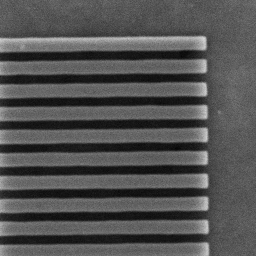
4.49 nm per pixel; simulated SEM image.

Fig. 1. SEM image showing groups of lines, slits or small figures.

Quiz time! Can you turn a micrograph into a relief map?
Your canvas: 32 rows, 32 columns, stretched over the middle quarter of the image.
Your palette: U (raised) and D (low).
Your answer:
UUUUUUUUUUUUUUUUUUUUUUUUUUUUUUUU
UUUUUUUUUUUUUUUUUUUUUUUUUUUUUUUU
DDDDDDDDDDDDDDDDDDDDDDDDDDDDDDDD
DDDDDDDDDDDDDDDDDDDDDDDDDDDDDDDD
DDDDDDDDDDDDDDDDDDDDDDDDDDDDDDDD
UUUUUUUUUUUUUUUUUUUUUUUUUUUUUUUU
UUUUUUUUUUUUUUUUUUUUUUUUUUUUUUUU
UUUUUUUUUUUUUUUUUUUUUUUUUUUUUUUU
DDDDDDDDDDDDDDDDDDDDDDDDDDDDDDDD
DDDDDDDDDDDDDDDDDDDDDDDDDDDDDDDD
DDDDDDDDDDDDDDDDDDDUUUUUDDDDDUUU
UUUUUUUUUUUUUUUUUUUUUUUUUUUUUUUU
UUUUUUUUUUUUUUUUUUUUUUUUUUUUUUUU
UUUUUUUUUUUUUUUUUUUUUUUUUUUUUUUU
DDDDDDDDDDDDDDDDDDDDDDDDDDDDDDDD
DDDDDDDDDDDDDDDDDDDDDDDDDDDDDDDD
DDDDDDDDDDUUUUUUUUUUUUUUUUUUUUUU
UUUUUUUUUUUUUUUUUUUUUUUUUUUUUUUU
UUUUUUUUUUUUUUUUUUUUUUUUUUUUUUUU
UUUUUUUUUUUUUUDDDDDDDDDDDDDDDDDD
DDDDDDDDDDDDDDDDDDDDDDDDDDDDDDDD
DDDDDDDDDDDDDDDDDDDDDDDDDDDDDDDD
UUUUUUUUUUUUUUUUUUUUUUUUUUUUUUUU
UUUUUUUUUUUUUUUUUUUUUUUUUUUUUUUU
UUUUUUUUUUUUUUUUUUUUUUUUUUUUUUUU
DDDDDDDDDDDDDDDDDDDDDDDDDDDDDDDD
DDDDDDDDDDDDDDDDDDDDDDDDDDDDDDDD
DDDDDDDDDDDDDDDDDDDDDDDDDDDDDDDD
UUUUUUUUUUUUUUUUUUUUUUUUUUUUUUUU
UUUUUUUUUUUUUUUUUUUUUUUUUUUUUUUU
UUUUUUUUUUUUUUUUUUUUUUUUUUUUUUUU
DDDDDDDDDDDDDDDDDDDDDDDDDDDDDDDD